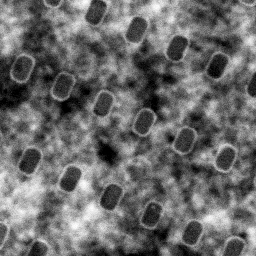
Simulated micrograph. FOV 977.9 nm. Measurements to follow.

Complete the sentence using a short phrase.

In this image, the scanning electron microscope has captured a regular array of raised bodies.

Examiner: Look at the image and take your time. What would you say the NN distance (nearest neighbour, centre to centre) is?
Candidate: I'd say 0.17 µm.